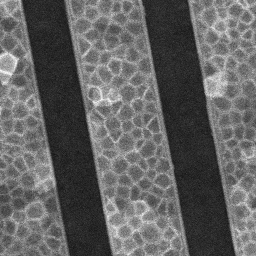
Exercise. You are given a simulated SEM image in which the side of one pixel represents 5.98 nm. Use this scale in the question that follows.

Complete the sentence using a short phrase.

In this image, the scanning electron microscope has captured one or a few lines or trenches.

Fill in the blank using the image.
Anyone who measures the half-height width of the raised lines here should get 434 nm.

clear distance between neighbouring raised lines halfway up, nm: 281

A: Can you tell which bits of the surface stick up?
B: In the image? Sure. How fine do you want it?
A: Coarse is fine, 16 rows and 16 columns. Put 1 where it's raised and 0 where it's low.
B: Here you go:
1000111110001111
1100111110001111
1100011110001111
1100011110000111
1100011111000111
1100011111000111
1100011111000111
1110001111000111
1110001111000111
1110001111100011
1110001111100011
1110001111100011
1111001111100011
1111000111100011
1111000111100001
1111000111110001